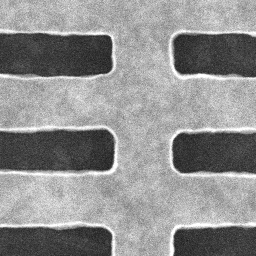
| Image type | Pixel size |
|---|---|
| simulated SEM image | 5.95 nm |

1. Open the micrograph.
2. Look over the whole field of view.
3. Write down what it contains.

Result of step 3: holes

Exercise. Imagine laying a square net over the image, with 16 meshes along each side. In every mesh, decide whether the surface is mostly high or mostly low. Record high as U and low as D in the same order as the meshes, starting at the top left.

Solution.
UUUUUUUUUUUUUUUU
UUUUUUUUUUUUUUUU
DDDDDDDUUUUDDDDD
DDDDDDDUUUUDDDDD
DDDDDDDUUUUDDDDD
UUUUUUUUUUUUUUUU
UUUUUUUUUUUUUUUU
UUUUUUUUUUUUUUUU
DDDDDDDUUUUDDDDD
DDDDDDDUUUUDDDDD
DDDDDDDUUUUDDDDD
UUUUUUUUUUUUUUUU
UUUUUUUUUUUUUUUU
UUUUUUUUUUUUUUUU
DDDDDDDUUUUDDDDD
DDDDDDDUUUUDDDDD